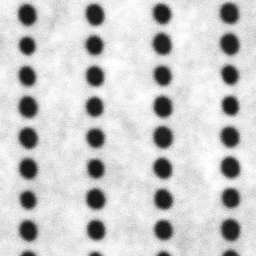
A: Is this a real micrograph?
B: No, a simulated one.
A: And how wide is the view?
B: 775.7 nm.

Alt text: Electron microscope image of a regular array of holes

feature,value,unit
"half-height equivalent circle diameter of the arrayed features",60.8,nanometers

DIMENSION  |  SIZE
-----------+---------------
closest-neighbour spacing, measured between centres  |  92.5 nanometers